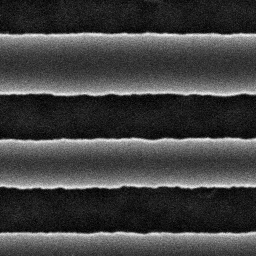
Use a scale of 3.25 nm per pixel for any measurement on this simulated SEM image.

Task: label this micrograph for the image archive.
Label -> lines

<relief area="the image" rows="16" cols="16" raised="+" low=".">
................
................
++++++++++++++++
++++++++++++++++
++++++++++++++++
++++++++++++++++
................
................
................
++++++++++++++++
++++++++++++++++
++++++++++++++++
................
................
................
++++++++++++++++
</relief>